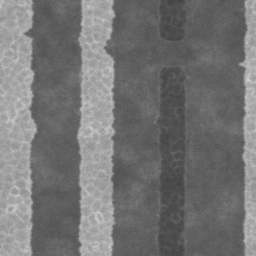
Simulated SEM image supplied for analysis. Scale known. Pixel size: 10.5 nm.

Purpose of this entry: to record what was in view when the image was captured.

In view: one or a few lines or trenches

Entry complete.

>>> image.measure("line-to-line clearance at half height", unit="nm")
527